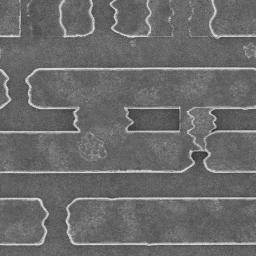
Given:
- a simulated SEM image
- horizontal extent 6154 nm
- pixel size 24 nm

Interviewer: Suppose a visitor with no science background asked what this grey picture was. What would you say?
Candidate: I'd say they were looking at one or a few lines or trenches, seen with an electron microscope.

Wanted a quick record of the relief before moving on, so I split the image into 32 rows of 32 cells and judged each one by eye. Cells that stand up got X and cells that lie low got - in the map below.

XX------XXX---XXXX---------XXXXX
XX------XXX---XXXXX--------XXXXX
XX------XXXX--XXXX--------XXXXXX
XX------XXXX--XXXXX-------XXXXXX
----------------X----------X----
--------------------------------
--------------------------------
--------------------------------
--------------------------------
X---XXXXXXXXXXXXXXXXXXXXXXXXXXXX
X---XXXXXXXXXXXXXXXXXXXXXXXXXXXX
X---XXXXXXXXXXXXXXXXXXXXXXXXXXXX
X---XXXXXXXXXXXXXXXXXXXXXXXXXXXX
---------XXXXXXX------XXXXXXXXXX
---------XXXXXXX------XXXXX-----
---------XXXXXXX------XXXXX-----
XX-------XXXXXXXXX----XXXXXXXXXX
XXXXXXXXXXXXXXXXXXXXXXXXXXXXXXXX
XXXXXXXXXXXXXXXXXXXXXXXXXXXXXXXX
XXXXXXXXXXXXXXXXXXXXXXXX--XXXXXX
XXXXXXXXXXXXXXXXXXXXXXXX--XXXXXX
--------------------------------
--------------------------------
--------------------------------
--------------------------------
XXXXX----XXXXXXXXXXXXXXXXXXXXXXX
XXXXXX---XXXXXXXXXXXXXXXXXXXXXXX
XXXXXX--XXXXXXXXXXXXXXXXXXXXXXXX
XXXXXX---XXXXXXXXXXXXXXXXXXXXXXX
XXXXXX---XXXXXXXXXXXXXXXXXXXXXXX
XXXXX-------------XX--XXX-------
--------------------------------